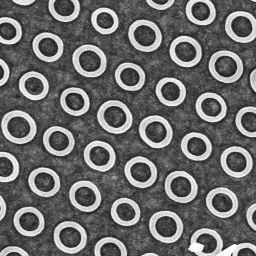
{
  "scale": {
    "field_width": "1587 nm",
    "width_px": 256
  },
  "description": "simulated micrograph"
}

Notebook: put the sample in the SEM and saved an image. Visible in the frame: a regular array of ring-shaped raised bodies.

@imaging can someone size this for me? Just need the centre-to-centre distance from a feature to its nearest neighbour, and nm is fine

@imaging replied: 264